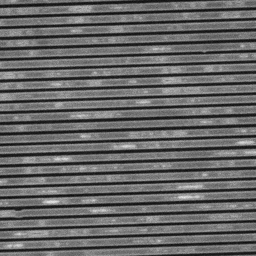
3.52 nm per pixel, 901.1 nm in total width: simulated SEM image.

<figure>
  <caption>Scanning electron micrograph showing parallel lines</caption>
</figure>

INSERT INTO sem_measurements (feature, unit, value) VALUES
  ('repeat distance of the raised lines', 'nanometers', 37.4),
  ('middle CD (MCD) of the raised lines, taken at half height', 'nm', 23.3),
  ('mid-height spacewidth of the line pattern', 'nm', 13.2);